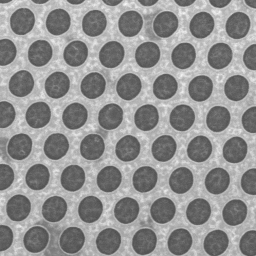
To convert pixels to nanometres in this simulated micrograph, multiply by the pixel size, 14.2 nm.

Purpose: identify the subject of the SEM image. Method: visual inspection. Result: a regular array of holes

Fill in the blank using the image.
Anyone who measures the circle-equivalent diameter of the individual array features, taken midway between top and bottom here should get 0.372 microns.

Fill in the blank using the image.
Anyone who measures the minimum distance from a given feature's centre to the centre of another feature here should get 0.505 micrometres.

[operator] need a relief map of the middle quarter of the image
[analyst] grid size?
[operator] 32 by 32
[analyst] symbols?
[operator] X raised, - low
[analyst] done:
X---XXXXXX----XXXXX----XXXXX----
XXXXXXXXXXXXXXXXXXXXXXXXXXXXXXXX
-XXXXX---XXXXXX---XXXXXXX-XXXXXX
-XXXX-----XXXX-----XXXX-----XXXX
--XX------XXX------XXX------XXXX
-XXX-------XX-------XX------XXX-
-XXX------XXX------XXX------XXX-
XXXXX-----XXX------XXX------XXX-
XXXXXX--XXXXXX----XXXXX----XXXXX
XXXXXXXXXXXXXXXXXXXXXXXXXXXXXXXX
X----XXXXX----XXXXX----XXXXX---X
------XXX------XXX-----XXXX-----
------XX-------XXX------XXX-----
------XX-------XXX------XX------
-----XXXX-----XXXX------XX------
-----XXXX-----XXXX-----XXXX-----
XX-XXXXXXXXXXXXXXXX---XXXXXX---X
XXXXXX--XXXXXXXXXXXXXXXXXXXXXXXX
-XXXX-----XXXX----XXXXX----XXXXX
-XXX------XXX------XXX------XXX-
-XXX------XXX------XXX------XXX-
-XXX------XXX------XXX------XXX-
-XXX------XXX------XXX------XXX-
XXXXX----XXXXX----XXXXX----XXXX-
XXXXXXXXXXXXXXX-XXXXXXXX-XXXXXXX
X---XXXXXXX-XXXXXXXX-XXXXXXXXXXX
-----XXXX-----XXXX-----XXXXX----
-----XXX------XXX------XXXX-----
-----XXX-------XX------XXX------
-----XXX------XXX------XXX------
-----XXXX-----XXX------XXX------
----XXXXX----XXXXX----XXXXX----X